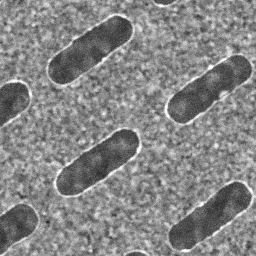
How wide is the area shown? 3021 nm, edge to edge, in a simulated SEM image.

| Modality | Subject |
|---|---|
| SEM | holes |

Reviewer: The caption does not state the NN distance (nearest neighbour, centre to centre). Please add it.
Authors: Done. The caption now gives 1.4 micrometres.